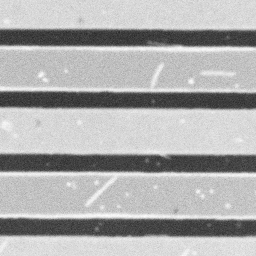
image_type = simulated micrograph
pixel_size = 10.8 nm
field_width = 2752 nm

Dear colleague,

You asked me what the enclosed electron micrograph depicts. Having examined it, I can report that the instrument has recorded lines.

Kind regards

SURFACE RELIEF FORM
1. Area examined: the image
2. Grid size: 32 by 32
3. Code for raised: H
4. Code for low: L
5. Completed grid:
HHHHHHHHHHHHHHHHHHHHHHHHHHHHHHHH
HHHHHHHHHHHHHHHHHHHHHHHHHHHHHHHH
HHHHHHHHHHHHHHHHHHHHHHHHHHHHHHHH
HHHHHHHHHHHHHHHHHHHHHHHHHHHHHHHH
LLLLLLLLLLLLLLLLLLLLLLLLLLLLLLLL
LLLLLLLLLLLLLLLLLLLLLLLLLLLLLLLL
HHHHHHHHHHHHHHHHHHHHHHHHHHHHHHHH
HHHHHHHHHHHHHHHHHHHHHHHHHHHHHHHH
HHHHHHHHHHHHHHHHHHHHHHHHHHHHHHHH
HHHHHHHHHHHHHHHHHHHHHHHHHHHHHHHH
HHHHHHHHHHHHHHHHHHHHHHHHHHHHHHHH
LLLLLLLLLLLLLLLLLLLLLLLLLLLLLLLH
LLLLLLLLLLLLLLLLLLLLLLLLLLLLLLLL
LLLLLLLLLLLLLLLLLLLLLLLLLLLLLLLL
HHHHHHHHHHHHHHHHHHHHHHHHHHHHHHHH
HHHHHHHHHHHHHHHHHHHHHHHHHHHHHHHH
HHHHHHHHHHHHHHHHHHHHHHHHHHHHHHHH
HHHHHHHHHHHHHHHHHHHHHHHHHHHHHHHH
HHHHHHHHHHHHHHHHHHHHHHHHHHHHHHHH
LLLLLLLLLLLLLLLLLLLLLLLLLLLLLLLL
LLLLLLLLLLLLLLLLLLLLLLLLLLLLLLLL
LLLLLLLLLLLLLLLLLLLLLLLLLLLLLLLL
HHHHHHHHHHHHHHHHHHHHHHHHHHHHHHHH
HHHHHHHHHHHHHHHHHHHHHHHHHHHHHHHH
HHHHHHHHHHHHHHHHHHHHHHHHHHHHHHHH
HHHHHHHHHHHHHHHHHHHHHHHHHHHHHHHH
HHHHHHHHHHHHHHHHHHHHHHHHHHHHHHHH
LLLLLLLLLLLLLLLLLLLLLLLLLLLLLLLL
LLLLLLLLLLLLLLLLLLLLLLLLLLLLLLLL
LLLLLLLLLLLLLLLLLLLLLLLLLLLLLLLL
HHHHHHHHHHHHHHHHHHHHHHHHHHHHHHHH
HHHHHHHHHHHHHHHHHHHHHHHHHHHHHHHH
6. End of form